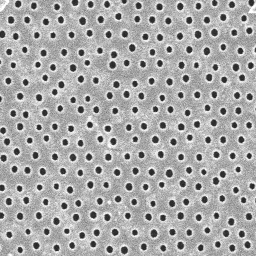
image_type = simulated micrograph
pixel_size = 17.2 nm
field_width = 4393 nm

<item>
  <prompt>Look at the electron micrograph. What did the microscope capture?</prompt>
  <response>a regular array of holes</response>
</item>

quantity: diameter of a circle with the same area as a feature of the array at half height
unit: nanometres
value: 118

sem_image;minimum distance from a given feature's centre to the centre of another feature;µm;0.256